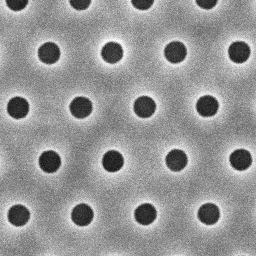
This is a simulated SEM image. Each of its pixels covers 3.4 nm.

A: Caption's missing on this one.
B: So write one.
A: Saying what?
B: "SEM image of a regular array of holes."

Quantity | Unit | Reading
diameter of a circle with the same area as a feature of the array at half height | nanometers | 79.7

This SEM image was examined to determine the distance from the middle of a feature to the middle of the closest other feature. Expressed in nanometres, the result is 213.